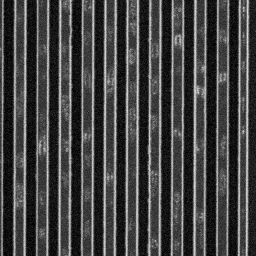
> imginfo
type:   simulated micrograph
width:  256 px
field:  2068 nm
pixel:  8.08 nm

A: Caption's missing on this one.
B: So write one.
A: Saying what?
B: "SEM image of parallel lines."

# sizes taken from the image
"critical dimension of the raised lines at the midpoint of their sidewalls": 84.9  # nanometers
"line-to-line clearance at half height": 92.9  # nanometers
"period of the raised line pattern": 180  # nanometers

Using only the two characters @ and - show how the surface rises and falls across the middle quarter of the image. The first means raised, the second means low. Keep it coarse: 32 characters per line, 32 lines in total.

@----@@---@@@---@@----@@---@@@--
@----@@---@@@---@@----@@---@@@--
@----@@---@@@---@@----@@---@@@--
@----@@---@@@---@@----@@---@@@--
@----@@---@@@---@@----@@---@@@--
@----@@---@@@---@@----@@---@@@--
@----@@---@@@---@@----@@---@@@--
@----@@---@@@---@@----@@---@@@--
@----@@---@@@---@@----@@---@@@--
@----@@---@@@---@@----@@---@@@--
@----@@---@@@---@@----@@---@@---
@----@@---@@@---@@----@@---@@---
@----@@---@@@---@@----@@---@@---
@----@@---@@@---@@----@@---@@---
@----@@---@@@---@@----@@---@@---
@----@@---@@@---@@----@@---@@---
@----@@---@@@---@@----@@---@@---
@----@@---@@@---@@----@@---@@---
@----@@---@@@---@@----@@---@@---
@----@@---@@@---@@----@@---@@---
@----@@---@@@---@@----@@---@@---
@----@@---@@@---@@----@@---@@---
@----@@---@@@---@@----@@---@@---
@----@@---@@@---@@----@@---@@---
@----@@---@@@---@@----@@---@@---
@----@@---@@@---@@----@@---@@---
@----@@---@@@---@@----@@---@@---
@----@@---@@@---@@----@@---@@---
@----@@---@@@---@@----@@---@@---
@----@@---@@@---@@----@@---@@---
@----@@---@@@---@@----@@---@@---
@----@@---@@@---@@----@@---@@---